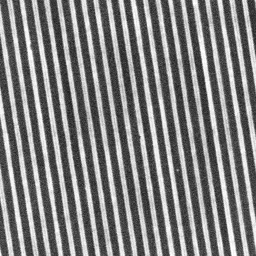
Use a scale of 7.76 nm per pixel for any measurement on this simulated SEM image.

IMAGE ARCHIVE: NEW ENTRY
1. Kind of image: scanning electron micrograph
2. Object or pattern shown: parallel lines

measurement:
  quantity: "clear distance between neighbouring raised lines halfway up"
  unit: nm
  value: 69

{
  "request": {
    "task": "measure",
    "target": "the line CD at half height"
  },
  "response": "30.7 nanometres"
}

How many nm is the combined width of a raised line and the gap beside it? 94.9